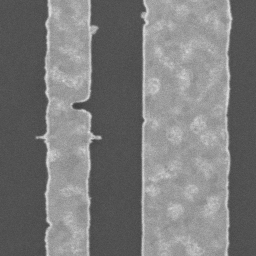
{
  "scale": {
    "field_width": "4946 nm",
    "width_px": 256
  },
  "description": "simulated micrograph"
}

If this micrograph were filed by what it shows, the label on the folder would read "one or a few lines or trenches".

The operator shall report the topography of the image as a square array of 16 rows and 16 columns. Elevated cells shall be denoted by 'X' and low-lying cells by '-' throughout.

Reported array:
---XXX---XXXXX--
---XXX---XXXXX--
---XXX---XXXXX--
---XXX---XXXXX--
---XXX---XXXXX--
---XXX---XXXXX--
---XX----XXXXX--
---XXX---XXXXX--
---XXX---XXXXX--
---XXX---XXXXX--
---XXX---XXXXX--
---XXX---XXXXX--
---XXX---XXXXX--
---XXX---XXXXX--
---XXX---XXXXX--
---XXX---XXXXX--